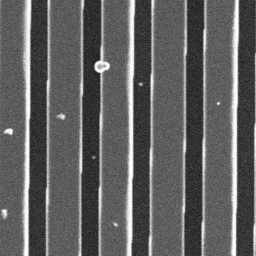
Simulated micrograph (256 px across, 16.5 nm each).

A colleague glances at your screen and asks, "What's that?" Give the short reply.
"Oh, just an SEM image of lines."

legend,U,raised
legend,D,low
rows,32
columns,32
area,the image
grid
UUUUDDUUUUDDDUUUUDDUUUUDDDUUUUDD
UUUUDDUUUUDDDUUUUDDUUUUDDDUUUUDD
UUUUDDUUUUDDDUUUUDDUUUUDDDUUUUDD
UUUUDDUUUUDDDUUUUDDUUUUDDDUUUUDD
UUUUDDUUUUDDDUUUUDDUUUUDDDUUUUDD
UUUUDDUUUUDDDUUUUDDUUUUDDDUUUUDD
UUUUDDUUUUDDDUUUUDDUUUUDDDUUUUDD
UUUUDDUUUUDDUUUUUDDUUUUDDDUUUUDD
UUUUDDUUUUDDUUUUUDDUUUUDDDUUUUDD
UUUUDDUUUUDDDUUUDDDUUUUDDDUUUUDD
UUUUDDUUUUDDDUUUDDDUUUUDDDUUUUDD
UUUUDDUUUUDDDUUUDDDUUUUDDDUUUUDD
UUUUDDUUUUDDDUUUDDDUUUUDDDUUUUDD
UUUUDDUUUUDDDUUUDDDUUUUDDDUUUUDD
UUUUDDUUUUDDDUUUDDDUUUUDDDUUUDDD
UUUUDDUUUUDDDUUUDDDUUUUDDDUUUDDD
UUUUDDUUUUDDDUUUDDDUUUUDDDUUUDDD
UUUUDDUUUUDDDUUUDDDUUUUDDUUUUDDD
UUUDDDUUUUDDDUUUDDDUUUUDDUUUUDDD
UUUDDDUUUUDDDUUUDDDUUUUDDUUUUDDD
UUUDDDUUUUDDDUUUDDDUUUUDDUUUUDDD
UUUDDDUUUUDDDUUUDDDUUUUDDUUUUDDD
UUUDDDUUUUDDDUUUDDDUUUUDDUUUUDDD
UUUDDDUUUUDDUUUUDDDUUUUDDUUUUDDD
UUUDDDUUUUDDUUUUDDDUUUUDDUUUUDDD
UUUDDDUUUUDDUUUUDDDUUUUDDUUUUDDD
UUUDDDUUUUDDUUUUDDDUUUUDDUUUUDDD
UUUDDDUUUUDDUUUUDDDUUUUDDUUUUDDD
UUUDDDUUUUDDUUUUDDDUUUUDDUUUUDDD
UUUDDDUUUUDDUUUUDDDUUUUDDUUUUDDD
UUUDDDUUUUDDUUUUDDDUUUUDDUUUUDDD
UUUDDDUUUUDDUUUUDDDUUUUDDUUUUDDD